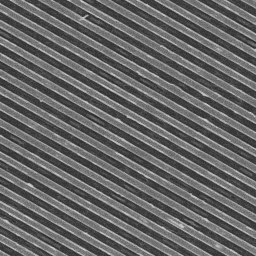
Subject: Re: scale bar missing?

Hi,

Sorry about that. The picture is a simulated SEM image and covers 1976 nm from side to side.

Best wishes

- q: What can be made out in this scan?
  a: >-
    parallel lines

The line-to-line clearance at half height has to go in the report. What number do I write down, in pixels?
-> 7.6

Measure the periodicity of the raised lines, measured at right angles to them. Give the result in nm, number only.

110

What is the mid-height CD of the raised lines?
52.1 nanometres